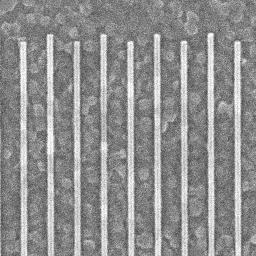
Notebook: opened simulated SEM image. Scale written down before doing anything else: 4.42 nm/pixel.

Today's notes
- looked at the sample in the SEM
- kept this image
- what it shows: parallel lines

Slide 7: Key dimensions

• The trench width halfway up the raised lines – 23 px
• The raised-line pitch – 0.118 microns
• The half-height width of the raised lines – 19.3 nanometres